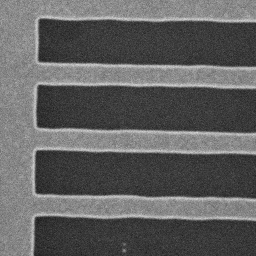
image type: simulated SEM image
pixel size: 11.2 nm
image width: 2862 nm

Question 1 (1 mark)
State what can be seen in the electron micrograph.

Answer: groups of lines, slits or small figures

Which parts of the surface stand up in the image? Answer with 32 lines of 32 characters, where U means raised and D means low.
UUUUUUUUUUUUUUUUUUUUUUUUUUUUUUUU
UUUUUUUUUUUUUUUUUUUUUUUUUUUUUUUU
UUUUUDDDUUDDDDDUUUUUUUUUUUUUUUUU
UUUUUDDDDDDDDDDDDDDDDDDDDDDDDDDD
UUUUUDDDDDDDDDDDDDDDDDDDDDDDDDDD
UUUUUDDDDDDDDDDDDDDDDDDDDDDDDDDD
UUUUUDDDDDDDDDDDDDDDDDDDDDDDDDDD
UUUUUDDDDDDDDDDDDDDDDDDDDDDDDDDD
UUUUUUUUUUUUUUUUUUUUUUUUUUUUUUUU
UUUUUUUUUUUUUUUUUUUUUUUUUUUUUUUU
UUUUUUUUUUUUUUUUUUUUUUUUUUUUUUUU
UUUUUDDDDDDDDDDDDDDDDDDDDDDDDDDD
UUUUUDDDDDDDDDDDDDDDDDDDDDDDDDDD
UUUUDDDDDDDDDDDDDDDDDDDDDDDDDDDD
UUUUDDDDDDDDDDDDDDDDDDDDDDDDDDDD
UUUUUDDDDDDDDDDDDDDDDDDDDDDDDDDD
UUUUUUUUUUUUUUUUUUUUUUUUUDDDDDDD
UUUUUUUUUUUUUUUUUUUUUUUUUUUUUUUU
UUUUUUUUUUUUUUUUUUUUUUUUUUUUUUUU
UUUUDDDDDDDDDDDDDDDDDDDDDDDDDDDD
UUUUDDDDDDDDDDDDDDDDDDDDDDDDDDDD
UUUUDDDDDDDDDDDDDDDDDDDDDDDDDDDD
UUUUDDDDDDDDDDDDDDDDDDDDDDDDDDDD
UUUUDDDDDDDDDDDDDDDDDDDDDDDDDDDD
UUUUUUUUUUUUDUUUUDDDDDDDDDDDDDDD
UUUUUUUUUUUUUUUUUUUUUUUUUUUUUUUU
UUUUUUUUUUUUUUUUUUUUUUUUUUUUUUUU
UUUUDDDDDDDDDDDDDDDDDDDDDDDDDDDU
UUUUDDDDDDDDDDDDDDDDDDDDDDDDDDDD
UUUUDDDDDDDDDDDDDDDDDDDDDDDDDDDD
UUUUDDDDDDDDDDDDDDDDDDDDDDDDDDDD
UUUUDDDDDDDDDDDDDDDDDDDDDDDDDDDD